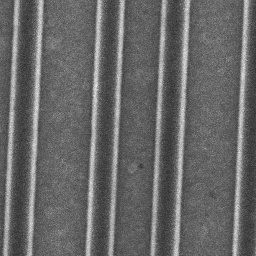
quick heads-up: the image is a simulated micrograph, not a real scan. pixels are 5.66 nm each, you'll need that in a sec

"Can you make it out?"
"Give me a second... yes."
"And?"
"one or a few lines or trenches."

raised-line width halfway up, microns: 0.139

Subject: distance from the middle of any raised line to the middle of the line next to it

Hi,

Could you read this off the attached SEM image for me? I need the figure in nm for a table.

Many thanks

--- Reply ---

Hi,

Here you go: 415